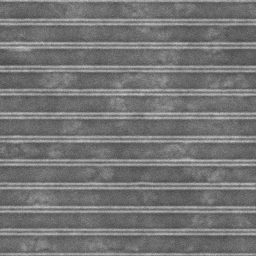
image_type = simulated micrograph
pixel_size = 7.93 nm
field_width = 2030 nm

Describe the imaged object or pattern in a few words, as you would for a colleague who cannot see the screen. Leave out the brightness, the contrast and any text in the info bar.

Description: parallel lines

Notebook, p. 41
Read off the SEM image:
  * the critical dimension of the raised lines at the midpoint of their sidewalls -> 33.7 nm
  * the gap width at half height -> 153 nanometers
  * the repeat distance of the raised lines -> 185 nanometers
